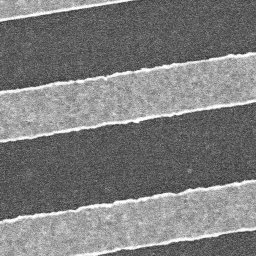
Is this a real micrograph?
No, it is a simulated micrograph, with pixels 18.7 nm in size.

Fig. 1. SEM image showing one or a few lines or trenches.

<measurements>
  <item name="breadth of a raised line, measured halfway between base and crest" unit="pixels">47.8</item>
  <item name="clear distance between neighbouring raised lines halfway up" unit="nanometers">1450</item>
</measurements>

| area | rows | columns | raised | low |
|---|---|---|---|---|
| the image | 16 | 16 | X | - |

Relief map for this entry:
XXXXX-----------
----------------
----------------
---------------X
--------XXXXXXXX
--XXXXXXXXXXXXXX
XXXXXXXXXXXXXXX-
XXXXXXXXX-------
XX--------------
----------------
----------------
---------------X
---------XXXXXXX
--XXXXXXXXXXXXXX
XXXXXXXXXXXXXX--
XXXXXXXX--------